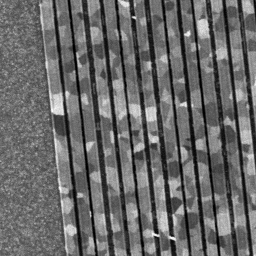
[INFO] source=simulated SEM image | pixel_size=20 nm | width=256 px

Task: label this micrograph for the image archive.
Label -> parallel lines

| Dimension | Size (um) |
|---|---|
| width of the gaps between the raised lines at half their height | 0.0993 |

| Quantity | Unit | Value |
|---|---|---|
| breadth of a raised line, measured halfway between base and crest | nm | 216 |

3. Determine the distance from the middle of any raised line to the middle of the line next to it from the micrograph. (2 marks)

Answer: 308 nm